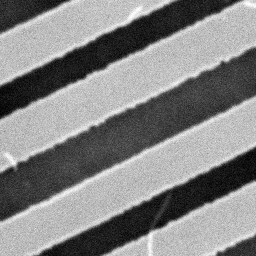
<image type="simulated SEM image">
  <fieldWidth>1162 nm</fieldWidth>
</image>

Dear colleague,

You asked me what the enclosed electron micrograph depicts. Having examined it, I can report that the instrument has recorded lines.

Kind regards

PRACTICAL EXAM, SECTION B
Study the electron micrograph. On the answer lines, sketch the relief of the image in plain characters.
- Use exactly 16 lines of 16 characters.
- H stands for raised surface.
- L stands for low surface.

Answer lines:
LLLHHHHHHHLLLLHH
LHHHHHHHLLLLHHHH
HHHHHHLLLLHHHHHH
HHHHLLLLHHHHHHHL
HHLLLLHHHHHHHLLL
LLLLHHHHHHHLLLLL
LLHHHHHHHLLLLLLH
HHHHHHHLLLLLLHHH
HHHHLLLLLLLHHHHH
HHLLLLLLLHHHHHHL
HLLLLLLHHHHHHLLL
LLLLLHHHHHHLLLLL
LLLHHHHHHLLLLLHH
LHHHHHHLLLLLHHHH
HHHHHLLLLLHHHHHH
HHHLLLLHHHHHHHLL